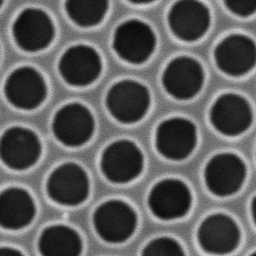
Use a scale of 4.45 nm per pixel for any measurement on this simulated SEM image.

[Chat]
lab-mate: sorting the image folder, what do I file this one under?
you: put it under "a regular array of holes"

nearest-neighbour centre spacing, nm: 264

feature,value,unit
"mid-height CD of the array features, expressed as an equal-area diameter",195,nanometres